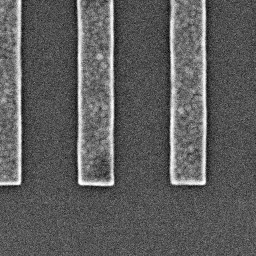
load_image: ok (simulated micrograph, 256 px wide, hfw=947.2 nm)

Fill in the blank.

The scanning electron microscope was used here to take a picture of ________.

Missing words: wiring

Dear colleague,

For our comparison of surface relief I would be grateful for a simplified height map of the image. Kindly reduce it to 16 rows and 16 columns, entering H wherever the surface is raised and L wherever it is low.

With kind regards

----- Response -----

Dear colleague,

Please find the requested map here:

HLLLLHHLLLLHHLLL
HLLLLHHLLLLHHLLL
HLLLLHHLLLLHHLLL
HLLLLHHLLLLHHLLL
HLLLLHHLLLLHHLLL
HLLLLHHLLLLHHLLL
HLLLLHHLLLLHHLLL
HLLLLHHLLLLHHLLL
HLLLLHHLLLLHHLLL
HLLLLHHLLLLHHLLL
HLLLLHHLLLLHHLLL
HLLLLHHLLLLHLLLL
LLLLLLLLLLLLLLLL
LLLLLLLLLLLLLLLL
LLLLLLLLLLLLLLLL
LLLLLLLLLLLLLLLL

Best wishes